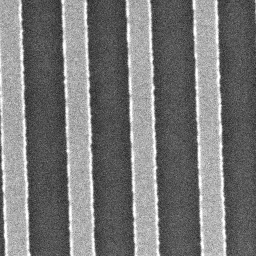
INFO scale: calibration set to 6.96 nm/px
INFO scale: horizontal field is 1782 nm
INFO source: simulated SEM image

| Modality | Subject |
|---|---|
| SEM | lines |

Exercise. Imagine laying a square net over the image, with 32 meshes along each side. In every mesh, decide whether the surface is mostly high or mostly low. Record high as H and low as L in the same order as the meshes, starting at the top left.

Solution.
HHHLLLLLHHHLLLLLHHHLLLLLHHHLLLLL
HHHLLLLLHHHLLLLLHHHLLLLLHHHLLLLL
HHHLLLLLHHHLLLLLHHHLLLLLHHHLLLLL
HHHLLLLLHHHLLLLLHHHLLLLLHHHLLLLL
HHHLLLLLHHHLLLLLHHHLLLLLHHHLLLLL
HHHLLLLLHHHLLLLLHHHLLLLLHHHLLLLL
HHHLLLLLHHHLLLLLHHHLLLLLHHHLLLLL
HHHLLLLLHHHLLLLLHHHLLLLLHHHLLLLL
HHHLLLLLHHHLLLLLHHHLLLLLLHHLLLLL
HHHLLLLLHHHLLLLLHHHLLLLLLHHLLLLL
HHHLLLLLHHHLLLLLHHHLLLLLLHHLLLLL
HHHLLLLLHHHLLLLLHHHLLLLLLHHLLLLL
HHHLLLLLHHHLLLLLHHHLLLLLLHHHLLLL
HHHLLLLLHHHLLLLLHHHLLLLLLHHHLLLL
HHHLLLLLHHHLLLLLHHHLLLLLLHHHLLLL
HHHLLLLLHHHLLLLLHHHLLLLLLHHHLLLL
HHHLLLLLHHHLLLLLHHHLLLLLLHHHLLLL
HHHLLLLLHHHLLLLLHHHLLLLLLHHHLLLL
HHHLLLLLHHHLLLLLLHHLLLLLLHHHLLLL
HHHLLLLLLHHLLLLLLHHLLLLLLHHHLLLL
HHHLLLLLLHHLLLLLLHHLLLLLLHHHLLLL
HHHLLLLLLHHLLLLLLHHLLLLLLHHHLLLL
HHHLLLLLLHHHLLLLLHHLLLLLLHHHLLLL
HHHLLLLLLHHHLLLLLHHHLLLLLHHHLLLL
LHHLLLLLLHHHLLLLLHHHLLLLLHHHLLLL
LHHLLLLLLHHHLLLLLHHHLLLLLHHHLLLL
LHHLLLLLLHHHLLLLLHHHLLLLLHHHLLLL
LHHHLLLLLHHHLLLLLHHHLLLLLHHHLLLL
LHHLLLLLLHHHLLLLLHHHLLLLLHHHLLLL
LHHHLLLLLHHHLLLLLHHHLLLLLHHHLLLL
LHHHLLLLLHHHLLLLLHHHLLLLLHHHLLLL
LHHHLLLLLHHHLLLLLHHHLLLLLHHHLLLL